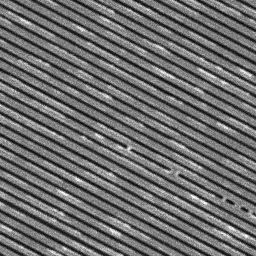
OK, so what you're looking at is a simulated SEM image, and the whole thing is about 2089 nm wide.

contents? parallel lines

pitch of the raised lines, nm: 78.4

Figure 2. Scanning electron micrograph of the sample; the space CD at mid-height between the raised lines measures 2.87 pixels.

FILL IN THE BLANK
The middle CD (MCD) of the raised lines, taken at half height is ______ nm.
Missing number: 53.3